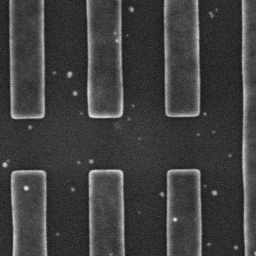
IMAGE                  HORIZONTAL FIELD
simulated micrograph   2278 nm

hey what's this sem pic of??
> groups of lines, slits or small figures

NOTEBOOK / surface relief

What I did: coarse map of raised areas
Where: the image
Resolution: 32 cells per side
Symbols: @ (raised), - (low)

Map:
-@@@@------@@@@------@@@@-----@@
-@@@@------@@@@------@@@@-----@@
-@@@@------@@@@------@@@@-----@@
-@@@@------@@@@------@@@@-----@@
-@@@@------@@@@------@@@@-----@@
-@@@@------@@@@------@@@@-----@@
-@@@@------@@@@------@@@@-----@@
-@@@@------@@@@------@@@@-----@@
-@@@@------@@@@------@@@@-----@@
-@@@@------@@@@------@@@@-----@@
-@@@@------@@@@------@@@@-----@@
-@@@@------@@@@------@@@@-----@@
-@@@@------@@@@------@@@@-----@@
-@@@@------@@@@------@@@@-----@@
--@@@------@@@@------@@-------@@
------------------------------@@
------------------------------@@
------------------------------@@
------------------------------@@
------------------------------@@
------------------------------@@
--@@@-------@@@------@@@@-----@@
--@@@@-----@@@@------@@@@-----@@
--@@@@-----@@@@------@@@@-----@@
--@@@@-----@@@@------@@@@------@
--@@@@-----@@@@------@@@@------@
--@@@@-----@@@@------@@@@------@
--@@@@-----@@@@------@@@@------@
--@@@@-----@@@@------@@@@------@
--@@@@-----@@@@------@@@@------@
--@@@@-----@@@@------@@@@------@
--@@@@-----@@@@------@@@@------@